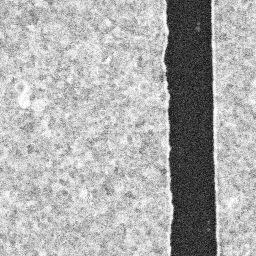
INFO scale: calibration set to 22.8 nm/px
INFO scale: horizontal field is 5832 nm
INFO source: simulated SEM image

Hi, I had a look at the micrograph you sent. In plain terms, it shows one or a few lines or trenches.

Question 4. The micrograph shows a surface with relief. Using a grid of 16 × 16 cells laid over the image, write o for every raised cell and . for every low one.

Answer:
oooooooooo...ooo
oooooooooo...ooo
oooooooooo...ooo
oooooooooo...ooo
oooooooooo...ooo
oooooooooo...ooo
oooooooooo...ooo
oooooooooo...ooo
oooooooooo...ooo
oooooooooo...ooo
oooooooooo...ooo
ooooooooooo...oo
ooooooooooo...oo
ooooooooooo...oo
ooooooooooo...oo
ooooooooooo...oo